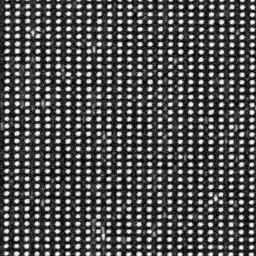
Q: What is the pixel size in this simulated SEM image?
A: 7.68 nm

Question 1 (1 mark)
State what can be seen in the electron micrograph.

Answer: a regular array of raised bodies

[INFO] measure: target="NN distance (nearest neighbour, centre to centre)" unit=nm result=55.5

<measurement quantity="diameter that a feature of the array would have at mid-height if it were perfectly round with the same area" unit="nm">32.4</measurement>